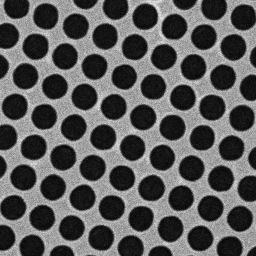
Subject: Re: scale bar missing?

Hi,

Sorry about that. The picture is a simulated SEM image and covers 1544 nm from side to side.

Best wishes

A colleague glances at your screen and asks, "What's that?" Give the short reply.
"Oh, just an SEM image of a regular array of holes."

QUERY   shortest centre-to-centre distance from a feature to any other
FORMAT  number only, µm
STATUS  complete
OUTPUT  0.187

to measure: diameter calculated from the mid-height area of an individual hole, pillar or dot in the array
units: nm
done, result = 155